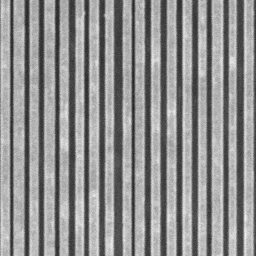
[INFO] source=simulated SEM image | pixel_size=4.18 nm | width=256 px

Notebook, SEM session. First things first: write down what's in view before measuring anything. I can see parallel lines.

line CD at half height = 32.9 nm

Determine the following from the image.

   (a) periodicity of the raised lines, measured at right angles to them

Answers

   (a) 63.8 nm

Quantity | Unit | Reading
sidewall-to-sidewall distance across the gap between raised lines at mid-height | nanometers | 29.3